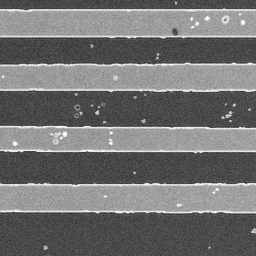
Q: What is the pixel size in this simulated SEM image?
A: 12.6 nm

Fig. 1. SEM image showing lines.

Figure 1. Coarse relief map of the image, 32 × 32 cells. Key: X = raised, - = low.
--------------------------------
XXXXXXXXXXXXXXXXXXXXXXXXXXXXXXXX
XXXXXXXXXXXXXXXXXXXXXXXXXXXXXXXX
XXXXXXXXXXXXXXXXXXXXXXXXXXXXXXXX
XXXXXXXXXXXXXXXXXXXXXXXXXXXXXXXX
--------------------------------
--------------------------------
--------------------------------
XXXXXXXXXXXXXXXXXXXXXXXXXXXXXXXX
XXXXXXXXXXXXXXXXXXXXXXXXXXXXXXXX
XXXXXXXXXXXXXXXXXXXXXXXXXXXXXXXX
--------------------------------
--------------------------------
--------------------------------
--------------------------------
--------------------------------
XXXXXXXXXXXXXXXXXXXXXXXXXXXXXXXX
XXXXXXXXXXXXXXXXXXXXXXXXXXXXXXXX
XXXXXXXXXXXXXXXXXXXXXXXXXXXXXXXX
--------------------------------
--------------------------------
--------------------------------
--------------------------------
XXXXXXXXXXXXXXXXXXXXXXXXXXXXXXXX
XXXXXXXXXXXXXXXXXXXXXXXXXXXXXXXX
XXXXXXXXXXXXXXXXXXXXXXXXXXXXXXXX
------------X-XXX-XXXXXX-XXXXXXX
--------------------------------
--------------------------------
--------------------------------
--------------------------------
--------------------------------